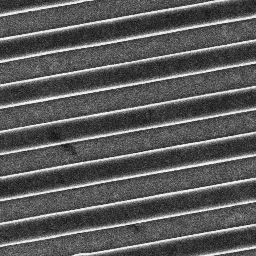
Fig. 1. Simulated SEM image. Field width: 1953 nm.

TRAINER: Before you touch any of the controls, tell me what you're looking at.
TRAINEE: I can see parallel lines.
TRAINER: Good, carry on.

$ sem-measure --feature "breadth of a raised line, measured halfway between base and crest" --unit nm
176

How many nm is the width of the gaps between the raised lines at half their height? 176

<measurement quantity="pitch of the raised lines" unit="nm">347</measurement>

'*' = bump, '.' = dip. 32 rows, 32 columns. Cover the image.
*********................*******
**.................*************
.............*****************..
........****************........
..*****************.............
*************................***
*******................*********
**................**************
............****************....
......*****************.........
.****************...............
***********.................****
******................**********
.................***************
...........****************.....
......****************..........
****************................
**********.................*****
****.................***********
...............*****************
.........*****************......
....****************............
**************.................*
*********................*******
****................************
..............****************..
........*****************.......
...****************.............
*************................***
*******.................********
*.................**************
............*****************...